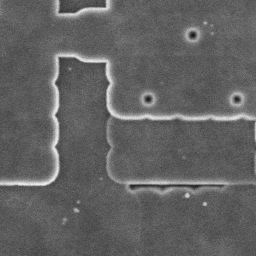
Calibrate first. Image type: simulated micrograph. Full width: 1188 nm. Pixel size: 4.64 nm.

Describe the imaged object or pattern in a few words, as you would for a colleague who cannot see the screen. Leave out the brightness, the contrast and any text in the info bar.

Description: wiring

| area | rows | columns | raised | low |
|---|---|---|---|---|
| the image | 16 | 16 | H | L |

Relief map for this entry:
HHHHLLHHHHHHHHHH
HHHHHHHHHHHHHHHH
HHHHHHHHHHHHHHHH
HHHHHHHHHHHHHHHH
HHHHLLLHHHHHHHHH
HHHHLLLHHHHHHHHH
HHHHLLLHHHHHHHHH
HHHHLLLLLLLLLLLL
HHHHLLLLLLLLLLLL
HHHHLLLLLLLLLLLL
HHHHLLLLLLLLLLLL
HHHLLLLLLLLLLLLL
LLLLLLLLLLLLLLLL
LLLLLLLLLLLLLLLL
LLLLLLLLLLLLLLLL
LLLLLLLLLLLLLLLL